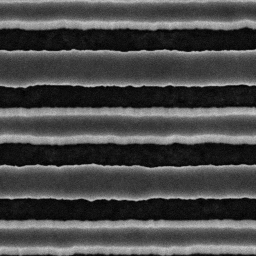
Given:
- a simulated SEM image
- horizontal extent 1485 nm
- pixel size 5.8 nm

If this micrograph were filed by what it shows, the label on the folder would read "lines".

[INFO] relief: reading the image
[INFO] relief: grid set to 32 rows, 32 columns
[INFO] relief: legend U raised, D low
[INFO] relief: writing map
UUUUUUUUUUUUUUUUUUUUUUUUUUUUUUUU
UUUUUUUUUUUUUUUUUUUUUUUUUUUUUUUU
UUUUUUUUUUUUUUUUUUUUUUUUUUUUUUUU
DDDDDDDDDDDDDDDDDDDDDDDDDDDDDDDD
DDDDDDDDDDDDDDDDDDDDDDDDDDDDDDDD
DDDDDDDDDDDDDDDDDDDDDDDDDDDDDDDD
UUUUUUUUUUUUUUUUUUUUUUUDUUUUUUUU
UUUUUUUUUUUUUUUUUUUUUUUUUUUUUUUU
UUUUUUUUUUUUUUUUUUUUUUUUUUUUUUUU
UUUUUUUUUUUUUUUUUUUUUUUUUUUUUUUU
UUUUUUUUUUUUUUUUUUUUUUUUUUUUUUUU
DDDDDDDDDDDDDDDDDDDDDDDDDDDDDDDD
DDDDDDDDDDDDDDDDDDDDDDDDDDDDDDDD
DDDDDDDDDDDDDDDDDDDDDDDDDDDDDDDD
UUUUUUUUUUUUUUUUUUUUUUUUUUUUUUUU
UUUUUUUUUUUUUUUUUUUUUUUUUUUUUUUU
UUUUUUUUUUUUUUUUUUUUUUUUUUUUUUUU
UDDUUUUUUUUUUUUUUUUUUUUUUDDDUUUU
DDDDDDDDDDDDDDDDDDDDDDDDDDDDDDDD
DDDDDDDDDDDDDDDDDDDDDDDDDDDDDDDD
DDDDDDDDDDDUDDDDDDDDDDDDDDDDDDDD
UUUUUUUUUUUUUUUUUUUUUUUUUUUUUUUU
UUUUUUUUUUUUUUUUUUUUUUUUUUUUUUUU
UUUUUUUUUUUUUUUUUUUUUUUUUUUUUUUU
UUUUUUUUUUUUUUUUUUUUUUUUUUUUUUUU
DDDDDDDDDDDDDDDDDDDDDDDDDDDDDDDD
DDDDDDDDDDDDDDDDDDDDDDDDDDDDDDDD
DDDDDDDDDDDDDDDDDDDDDDDDDDDDDDDD
UUUUUUUUUUUUUUUUUUUUUUUUUUUUUUUU
UUUUUUUUUUUUUUUUUUUUUUUUUUUUUUUU
UUUUUUUUUUUUUUUUUUUUUUUUUUUUUUUU
DDUDDDDUUDDDDDDDDDDDUDDDDDDDDDDD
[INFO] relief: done